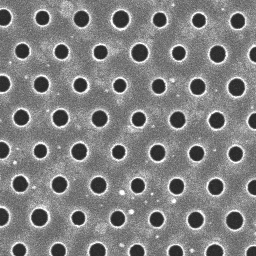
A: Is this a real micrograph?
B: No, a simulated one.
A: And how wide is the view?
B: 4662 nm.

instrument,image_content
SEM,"a regular array of holes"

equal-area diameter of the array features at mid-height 0.275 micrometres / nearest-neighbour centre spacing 0.7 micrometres